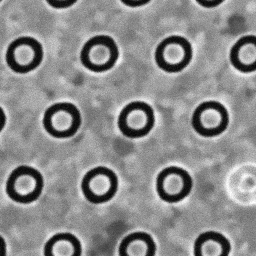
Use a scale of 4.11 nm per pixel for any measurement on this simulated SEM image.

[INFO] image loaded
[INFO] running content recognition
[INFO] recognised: a regular array of ring-shaped grooves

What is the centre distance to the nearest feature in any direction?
0.304 microns